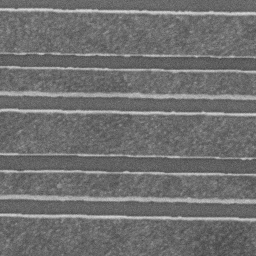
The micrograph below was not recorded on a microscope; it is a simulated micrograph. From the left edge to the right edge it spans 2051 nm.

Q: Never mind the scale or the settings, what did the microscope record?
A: lines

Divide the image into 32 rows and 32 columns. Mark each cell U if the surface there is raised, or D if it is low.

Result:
DDDDDDDDDDDDDDDDDDDDDDDDDDDDDDDD
UUUUUUUUUUUUUUUUUDDDDDDDDDDDDDDD
UUUUUUUUUUUUUUUUUUUUUUUUUUUUUUUU
UUUUUUUUUUUUUUUUUUUUUUUUUUUUUUUU
UUUUUUUUUUUUUUUUUUUUUUUUUUUUUUUU
UUUUUUUUUUUUUUUUUUUUUUUUUUUUUUUU
UUUUUUUUUUUUUUUUUUUUUUUUUUUUUUUU
DDDDDDDDDDDDDDDDDDDDDDDDDDDDDDDD
UUUUUUUUDDDDDDDDDDDDDDDDDDDDDDDD
UUUUUUUUUUUUUUUUUUUUUUUUUUUUUUUU
UUUUUUUUUUUUUUUUUUUUUUUUUUUUUUUU
UUUUUUUUUUUUUUUUUUUUUUUUUUUUUUUU
DDDDDDDDDDDDDDDDDDDDDDDDDDDDDDDD
DDDDDDDDDDDDDDDDDDDDDDDDDDDDDDDD
UUUUUUUUUUUUUUUUUUUUUUUUUUUUUUUU
UUUUUUUUUUUUUUUUUUUUUUUUUUUUUUUU
UUUUUUUUUUUUUUUUUUUUUUUUUUUUUUUU
UUUUUUUUUUUUUUUUUUUUUUUUUUUUUUUU
UUUUUUUUUUUUUUUUUUUUUUUUUUUUUUUU
DDDDDDDDDDDDDDDDUUUUUUUUUUUUUUUU
DDDDDDDDDDDDDDDDDDDDDDDDDDDDDDDD
UUUUUUUUUUUUDDDDDDDDDDDDDDDDDDDD
UUUUUUUUUUUUUUUUUUUUUUUUUUUUUUUU
UUUUUUUUUUUUUUUUUUUUUUUUUUUUUUUU
UDUUUUUUUUUUUUUUUUUUUUUUUUUUUUUU
DDDDDDDDDDDDDDDDDDDDDDDDDDDDDDDD
DDDDDDDDDDDDDDDDDDDDDDDDDDDDDDDD
UUUUUUUUUUUUUUUUUUUUUUUUUUUUUUUU
UUUUUUUUUUUUUUUUUUUUUUUUUUUUUUUU
UUUUUUUUUUUUUUUUUUUUUUUUUUUUUUUU
UUUUUUUUUUUUUUUUUUUUUUUUUUUUUUUU
UUUUUUUUUUUUUUUUUUUUUUUUUUUUUUUU